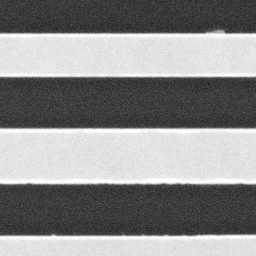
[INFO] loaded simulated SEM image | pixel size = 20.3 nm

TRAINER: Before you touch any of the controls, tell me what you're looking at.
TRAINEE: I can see lines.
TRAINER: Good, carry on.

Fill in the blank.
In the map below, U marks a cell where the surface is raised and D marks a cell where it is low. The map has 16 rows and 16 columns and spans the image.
DDDDDDDDDDDDDDDD
DDDDDDDDDDDDDDDD
UUUUUUUUUUUUUUUU
UUUUUUUUUUUUUUUU
UUUUUUUUUUUUUUUU
DDDDDDDDDDDDDDDD
DDDDDDDDDDDDDDDD
DDDDDDDDDDDDDDDD
UUUUUUUUUUUUUUUU
UUUUUUUUUUUUUUUU
UUUUUUUUUUUUUUUU
DDDDDDDDDDDDDDDD
DDDDDDDDDDDDDDDD
DDDDDDDDDDDDDDDD
DDDDDDDDDDDDDDDD
UUUUUUUUUUUUUUUU